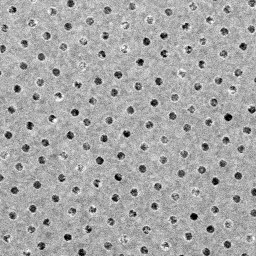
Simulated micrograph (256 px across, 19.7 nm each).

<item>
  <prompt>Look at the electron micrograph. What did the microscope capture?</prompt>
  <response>a regular array of holes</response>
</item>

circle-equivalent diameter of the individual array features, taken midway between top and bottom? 168 nanometres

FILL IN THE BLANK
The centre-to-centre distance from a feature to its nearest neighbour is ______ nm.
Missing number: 396